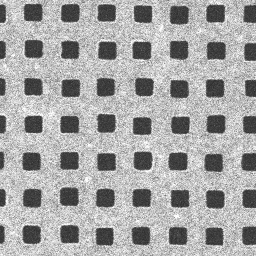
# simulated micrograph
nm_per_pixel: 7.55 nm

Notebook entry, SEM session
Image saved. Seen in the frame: a regular array of holes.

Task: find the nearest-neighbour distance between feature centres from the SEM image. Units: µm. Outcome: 0.268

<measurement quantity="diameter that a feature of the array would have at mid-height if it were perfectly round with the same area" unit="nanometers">152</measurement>